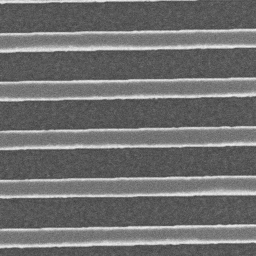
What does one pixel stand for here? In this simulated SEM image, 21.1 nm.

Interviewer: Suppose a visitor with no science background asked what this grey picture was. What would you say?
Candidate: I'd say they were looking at lines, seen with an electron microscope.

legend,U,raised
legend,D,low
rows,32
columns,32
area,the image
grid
DDDDDDDDDDDDDDDDDDDDDDDDDDDDDDDD
DDDDDDDDDDDDDDDDDDDDDDDDDDDDDDDD
DDDDDDDDDDDDDDDDDDDDDDDDDDDDDDDD
DDDDDDDDDDDDDDDDDDDDDDDDDDDDDDDD
UUUUUUUUUUUUUUUUUUUUUUUUUUUUUUUU
UUUUUUUUUUUUUUUUUUUUUUUUUUUUUUUU
UDDDDDDDDDDDDDDDDDDDDDDDDDDDDDDD
DDDDDDDDDDDDDDDDDDDDDDDDDDDDDDDD
DDDDDDDDDDDDDDDDDDDDDDDDDDDDDDDD
DDDDDDDDDDDDDDDDDDDDDDDDDDDDDDDD
UUUUUUUUUUUUUUUUUUUUUUUUUUUUUUUU
UUUUUUUUUUUUUUUUUUUUUUUUUUUUUUUU
UUUDDDDDDDDDDDDDDDDDDDDDDDDDDDDD
DDDDDDDDDDDDDDDDDDDDDDDDDDDDDDDD
DDDDDDDDDDDDDDDDDDDDDDDDDDDDDDDD
DDDDDDDDDDDDDDDDDDDDDDDDDDDDDDDD
UUUUUUUUUUUUUUUUUUUUUUUUUUUUUUUU
UUUUUUUUUUUUUUUUUUUUUUUUUUUUUUUU
UUUUUUUUUUDDDDDDDDDDDDDDDDDDDDDD
DDDDDDDDDDDDDDDDDDDDDDDDDDDDDDDD
DDDDDDDDDDDDDDDDDDDDDDDDDDDDDDDD
DDDDDDDDDDDDDDDDDDDDDDDDDDDDDDDD
DDDDUUUUUUUUUUUUUUUUUUUUUUUUUUUU
UUUUUUUUUUUUUUUUUUUUUUUUUUUUUUUU
UUUUUUUUUUUUUUUUUDDDDDDDDDDDDDDD
DDDDDDDDDDDDDDDDDDDDDDDDDDDDDDDD
DDDDDDDDDDDDDDDDDDDDDDDDDDDDDDDD
DDDDDDDDDDDDDDDDDDDDDDDDDDDDDDDD
DDDDDDDDDDDUUUUUUUUUUUUUUUUUUUUU
UUUUUUUUUUUUUUUUUUUUUUUUUUUUUUUU
UUUUUUUUUUUUUUUUUUUUDDDDDDDDDDDD
DDDDDDDDDDDDDDDDDDDDDDDDDDDDDDDD